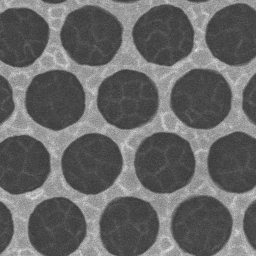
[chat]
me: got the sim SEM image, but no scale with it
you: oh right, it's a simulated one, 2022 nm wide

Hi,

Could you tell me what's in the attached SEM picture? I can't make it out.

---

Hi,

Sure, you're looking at holes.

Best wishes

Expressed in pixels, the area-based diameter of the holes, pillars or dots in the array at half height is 61.3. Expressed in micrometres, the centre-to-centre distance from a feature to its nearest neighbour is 0.572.